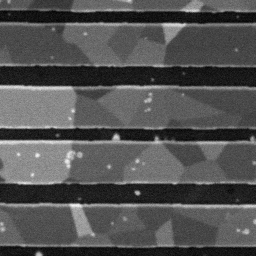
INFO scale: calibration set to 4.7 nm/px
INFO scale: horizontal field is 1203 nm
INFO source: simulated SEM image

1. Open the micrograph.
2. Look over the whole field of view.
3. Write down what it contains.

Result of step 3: lines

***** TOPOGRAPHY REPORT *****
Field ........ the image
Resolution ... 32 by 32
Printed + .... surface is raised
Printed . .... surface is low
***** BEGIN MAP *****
++++++++++++++++++++++++++++++++
..........................+.....
................................
++++++++++++++++++++++++++++++++
++++++++++++++++++++++++++++++++
++++++++++++++++++++++++++++++++
++++++++++++++++++++++++++++++++
++++++++++++++++++++++++++++++++
................................
................................
................................
++++++++++++++++++++++++++++++++
++++++++++++++++++++++++++++++++
++++++++++++++++++++++++++++++++
++++++++++++++++++++++++++++++++
++++++++++++++++++++++++++++++++
................................
................................
++++++++++++++++++++++++++++++++
++++++++++++++++++++++++++++++++
++++++++++++++++++++++++++++++++
++++++++++++++++++++++++++++++++
++++++++++++++++++++++++++++++++
................................
................................
................................
++++++++++++++++++++++++++++++++
++++++++++++++++++++++++++++++++
++++++++++++++++++++++++++++++++
++++++++++++++++++++++++++++++++
++++++++++++++++++++++++++++++++
................................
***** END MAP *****